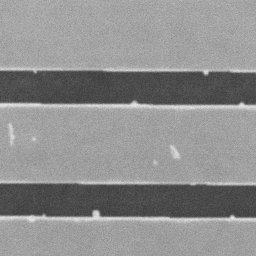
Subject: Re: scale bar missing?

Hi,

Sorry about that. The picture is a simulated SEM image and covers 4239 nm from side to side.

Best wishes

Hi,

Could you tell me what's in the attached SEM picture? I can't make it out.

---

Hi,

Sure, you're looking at lines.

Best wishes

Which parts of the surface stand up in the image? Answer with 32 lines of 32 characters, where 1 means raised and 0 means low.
11111111111111111111111111111111
11111111111111111111111111111111
11111111111111111111111111111111
11111111111111111111111111111111
11111111111111111111111111111111
11111111111111111111111111111111
11111111111111111111111111111111
11111111111111111111111111111111
11111111111111111111111111111111
00000000000000000000000000000000
00000000000000000000000000000000
00000000000000000000000000000000
00000000000000000000000000000000
11111111111111111111111111111111
11111111111111111111111111111111
11111111111111111111111111111111
11111111111111111111111111111111
11111111111111111111111111111111
11111111111111111111111111111111
11111111111111111111111111111111
11111111111111111111111111111111
11111111111111111111111111111111
11111111111111111111111111111111
00000000000000000000000000000000
00000000000000000000000000000000
00000000000000000000000000000000
00000000000000000000000000000000
11111111111111111111111111111111
11111111111111111111111111111111
11111111111111111111111111111111
11111111111111111111111111111111
11111111111111111111111111111111